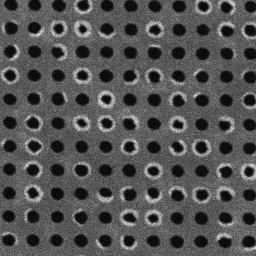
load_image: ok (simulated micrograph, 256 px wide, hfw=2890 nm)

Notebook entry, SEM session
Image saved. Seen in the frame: a regular array of holes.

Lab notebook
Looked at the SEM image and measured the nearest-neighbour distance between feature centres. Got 0.261 microns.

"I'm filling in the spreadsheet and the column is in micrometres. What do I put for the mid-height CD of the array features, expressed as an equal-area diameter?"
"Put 0.145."